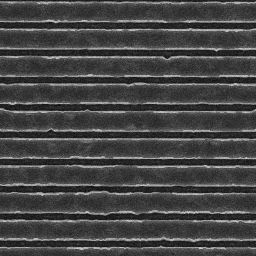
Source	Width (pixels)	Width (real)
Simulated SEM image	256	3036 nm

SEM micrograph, parallel lines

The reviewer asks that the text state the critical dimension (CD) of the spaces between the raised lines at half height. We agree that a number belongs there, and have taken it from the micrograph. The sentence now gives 74.1 nm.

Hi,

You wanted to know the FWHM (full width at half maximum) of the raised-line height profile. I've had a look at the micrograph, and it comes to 242 nm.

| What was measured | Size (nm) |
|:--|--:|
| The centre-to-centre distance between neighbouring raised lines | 323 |